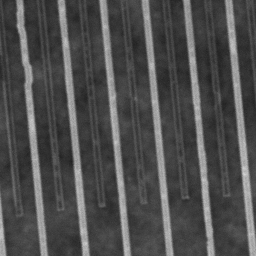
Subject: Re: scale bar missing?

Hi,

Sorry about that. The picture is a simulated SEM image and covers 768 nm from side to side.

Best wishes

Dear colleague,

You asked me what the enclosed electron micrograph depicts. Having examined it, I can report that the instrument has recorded parallel lines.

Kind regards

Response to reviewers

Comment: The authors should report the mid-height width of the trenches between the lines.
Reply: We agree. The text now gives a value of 0.0463 microns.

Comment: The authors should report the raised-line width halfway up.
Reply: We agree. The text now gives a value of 0.0175 um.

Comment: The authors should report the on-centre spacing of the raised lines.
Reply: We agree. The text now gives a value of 62.5 nm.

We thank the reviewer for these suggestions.